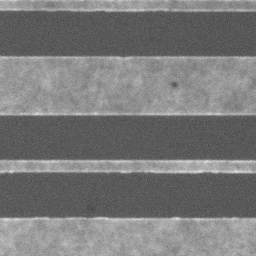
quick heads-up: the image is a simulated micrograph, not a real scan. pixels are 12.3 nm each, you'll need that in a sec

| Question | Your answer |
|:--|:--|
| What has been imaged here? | lines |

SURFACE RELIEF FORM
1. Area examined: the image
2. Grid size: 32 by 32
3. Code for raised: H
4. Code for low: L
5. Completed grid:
HHHHHHHHHHHHHHHHHHHHHHHHHHHHHHHH
LLLLLLLLLLLLLLLLLLLLLLLLLLLLLLLL
LLLLLLLLLLLLLLLLLLLLLLLLLLLLLLLL
LLLLLLLLLLLLLLLLLLLLLLLLLLLLLLLL
LLLLLLLLLLLLLLLLLLLLLLLLLLLLLLLL
LLLLLLLLLLLLLLLLLLLLLLLLLLLLLLLL
LLLLLLLLLLLLLLLLLLLLLLLLLLLLLLLL
HHHHHHHHHHHHHHHHHHHHHHHHHHHHHHHH
HHHHHHHHHHHHHHHHHHHHHHHHHHHHHHHH
HHHHHHHHHHHHHHHHHHHHHHHHHHHHHHHH
HHHHHHHHHHHHHHHHHHHHHHHHHHHHHHHH
HHHHHHHHHHHHHHHHHHHHHHHHHHHHHHHH
HHHHHHHHHHHHHHHHHHHHHHHHHHHHHHHH
HHHHHHHHHHHHHHHHHHHHHHHHHHHHHHHH
LLLLLLLLLLLLLLLLLLLLLLLLLLLLLLLL
LLLLLLLLLLLLLLLLLLLLLLLLLLLLLLLL
LLLLLLLLLLLLLLLLLLLLLLLLLLLLLLLL
LLLLLLLLLLLLLLLLLLLLLLLLLLLLLLLL
LLLLLLLLLLLLLLLLLLLLLLLLLLLLLLLL
LLLLLLLLLLLLLLLLLLLLLLLLLLLLLLLL
HHHHHHHHHHHHHHHHHHHHHHHHHHHHHHHH
HHLLLLLLLLLLLLLHHLHHHHHHHLHHHHHH
LLLLLLLLLLLLLLLLLLLLLLLLLLLLLLLL
LLLLLLLLLLLLLLLLLLLLLLLLLLLLLLLL
LLLLLLLLLLLLLLLLLLLLLLLLLLLLLLLL
LLLLLLLLLLLLLLLLLLLLLLLLLLLLLLLL
LLLLLLLLLLLLLLLLLLLLLLLLLLLLLLLL
HHHHHHHHHHHHHHHHHHHHHHHHHHHHHHHH
HHHHHHHHHHHHHHHHHHHHHHHHHHHHHHHH
HHHHHHHHHHHHHHHHHHHHHHHHHHHHHHHH
HHHHHHHHHHHHHHHHHHHHHHHHHHHHHHHH
HHHHHHHHHHHHHHHHHHHHHHHHHHHHHHHH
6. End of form